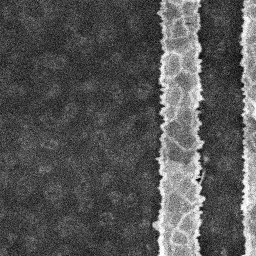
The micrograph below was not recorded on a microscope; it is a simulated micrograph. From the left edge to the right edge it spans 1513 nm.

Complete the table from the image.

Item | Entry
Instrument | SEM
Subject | one or a few lines or trenches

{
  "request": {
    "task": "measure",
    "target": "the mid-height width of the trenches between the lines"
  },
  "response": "265 nanometres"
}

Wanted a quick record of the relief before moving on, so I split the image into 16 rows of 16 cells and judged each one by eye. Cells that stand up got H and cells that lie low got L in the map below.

LLLLLLLLLLHHLLLH
LLLLLLLLLLHHLLLH
LLLLLLLLLLHHLLLH
LLLLLLLLLLHHLLLH
LLLLLLLLLLHHLLLH
LLLLLLLLLLHHLLLH
LLLLLLLLLLHHLLLH
LLLLLLLLLLHHLLLH
LLLLLLLLLLHHLLLH
LLLLLLLLLLHHLLLH
LLLLLLLLLLHHLLLH
LLLLLLLLLLHHLLLH
LLLLLLLLLLHHHLLH
LLLLLLLLLLHHLLLH
LLLLLLLLLLHHLLLH
LLLLLLLLLLHHLLLH